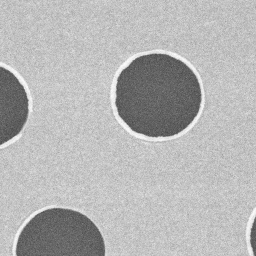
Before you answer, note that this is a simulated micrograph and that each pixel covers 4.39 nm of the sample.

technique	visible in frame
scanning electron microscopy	holes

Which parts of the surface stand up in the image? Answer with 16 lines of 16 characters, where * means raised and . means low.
****************
****************
****************
*********..*****
.*******....****
.******......***
..*****......***
..******....****
.********..*****
****************
****************
****************
****************
**...***********
*.....**********
*......*********